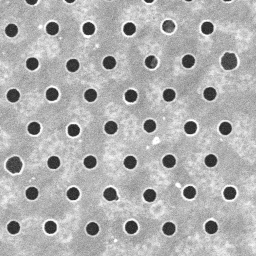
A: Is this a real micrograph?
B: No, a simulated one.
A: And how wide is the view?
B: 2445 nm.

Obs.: a regular array of holes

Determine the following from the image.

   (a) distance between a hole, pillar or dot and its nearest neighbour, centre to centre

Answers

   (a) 0.351 µm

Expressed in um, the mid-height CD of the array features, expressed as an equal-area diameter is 0.133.